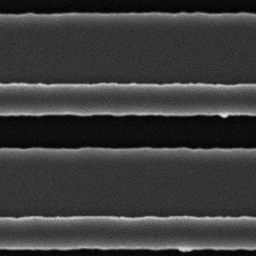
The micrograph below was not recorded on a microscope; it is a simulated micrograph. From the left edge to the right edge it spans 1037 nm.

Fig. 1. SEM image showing lines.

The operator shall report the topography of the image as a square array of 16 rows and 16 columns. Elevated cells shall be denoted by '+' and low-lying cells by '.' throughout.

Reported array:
................
++++++++++++++++
++++++++++++++++
++++++++++++++++
++++++++++++++++
++++++++++++++++
++++++++++++++++
................
................
++++++++++++++++
++++++++++++++++
++++++++++++++++
++++++++++++++++
++++++++++++++++
++++++++++++++++
++++++++++++++++